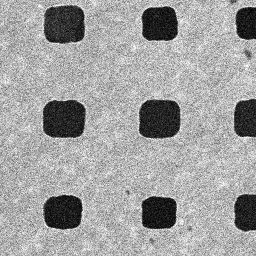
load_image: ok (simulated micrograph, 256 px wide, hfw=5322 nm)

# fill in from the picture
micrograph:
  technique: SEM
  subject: holes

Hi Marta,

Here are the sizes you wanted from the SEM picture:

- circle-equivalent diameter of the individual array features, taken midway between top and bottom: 843 nanometres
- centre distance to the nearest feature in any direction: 1950 nm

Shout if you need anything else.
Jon